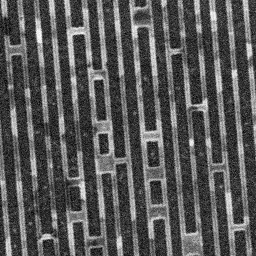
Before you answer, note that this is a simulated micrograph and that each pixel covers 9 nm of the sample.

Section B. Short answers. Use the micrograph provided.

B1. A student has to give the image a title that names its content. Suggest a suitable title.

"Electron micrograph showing parallel lines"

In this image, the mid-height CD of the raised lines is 31.4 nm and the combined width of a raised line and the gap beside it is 144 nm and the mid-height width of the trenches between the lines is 0.111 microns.